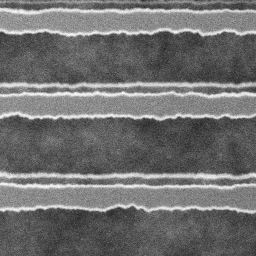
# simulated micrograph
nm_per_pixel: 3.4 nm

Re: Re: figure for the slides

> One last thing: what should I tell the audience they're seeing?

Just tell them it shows lines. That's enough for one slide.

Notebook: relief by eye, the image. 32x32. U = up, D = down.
DDDDDDDDDDDDDDDDDDDDDDDDDDDDDDDD
UUUUUUUUUUUUUUUUUUUUUUUUUUUUUUUU
UUUUUUUUUUUUUUUUUUUUUUUUUUUUUUUU
UUUUUUUUUUUUUUUUUUUUUUUUUUUUUUUU
DDDDDDDDDDDDDDDDDDDDDDDDDDDDDDDD
DDDDDDDDDDDDDDDDDDDDDDDDDDDDDDDD
DDDDDDDDDDDDDDDDDDDDDDDDDDDDDDDD
DDDDDDDDDDDDDDDDDDDDDDDDDDDDDDDD
DDDDDDDDDDDDDDDDDDDDDDDDDDDDDDDD
DDDDDDDDDDDDDDDDDDDDDDDDDDDDDDDD
DDDDDDDDDDDDDDDDDDDDDDDDDDDDDDDD
DDDDDDDDDDDUUUDDDDDDDUDDDDDDDDDD
UUUUUUUUUUUUUUUUUUUUUUUUUUUUUUUU
UUUUUUUUUUUUUUUUUUUUUUUUUUUUUUUU
DDDUUUUUUUUUUDDUUUUUUUDUUUUUUUUU
DDDDDDDDDDDDDDDDDDDDDDDDDDDDDDDD
DDDDDDDDDDDDDDDDDDDDDDDDDDDDDDDD
DDDDDDDDDDDDDDDDDDDDDDDDDDDDDDDD
DDDDDDDDDDDDDDDDDDDDDDDDDDDDDDDD
DDDDDDDDDDDDDDDDDDDDDDDDDDDDDDDD
DDDDDDDDDDDDDDDDDDDDDDDDDDDDDDDD
DDDDDDDDDDDDDDDDDDDDDDDDDDDDDDDD
DDDDDDDDDDDDDDDDDDDDDDDDDDDDDDDD
UUUUUUUUUUUUUUUUUUUUUUUUUUUUUUUU
UUUUUUUUUUUUUUUUUUUUUUUUUUUUUUUU
UUUUUUUUUUUUUUUUUUUUUUUUUUUUUUUU
DDDDDDDDDDDDDDDDDDDDDDDDDDDDDDDU
DDDDDDDDDDDDDDDDDDDDDDDDDDDDDDDD
DDDDDDDDDDDDDDDDDDDDDDDDDDDDDDDD
DDDDDDDDDDDDDDDDDDDDDDDDDDDDDDDD
DDDDDDDDDDDDDDDDDDDDDDDDDDDDDDDD
DDDDDDDDDDDDDDDDDDDDDDDDDDDDDDDD